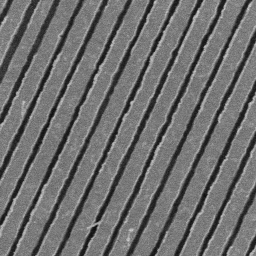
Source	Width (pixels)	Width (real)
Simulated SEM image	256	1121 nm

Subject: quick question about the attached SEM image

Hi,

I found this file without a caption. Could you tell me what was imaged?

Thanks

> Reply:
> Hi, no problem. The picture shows parallel lines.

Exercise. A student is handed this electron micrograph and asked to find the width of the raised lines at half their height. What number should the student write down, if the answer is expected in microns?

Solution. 0.0724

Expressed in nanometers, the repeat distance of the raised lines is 94.2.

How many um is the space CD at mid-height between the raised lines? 0.0237